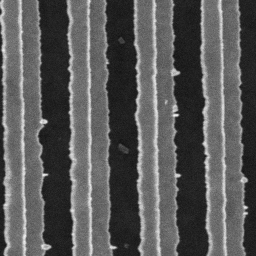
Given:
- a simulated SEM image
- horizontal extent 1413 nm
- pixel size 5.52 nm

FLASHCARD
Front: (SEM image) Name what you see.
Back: lines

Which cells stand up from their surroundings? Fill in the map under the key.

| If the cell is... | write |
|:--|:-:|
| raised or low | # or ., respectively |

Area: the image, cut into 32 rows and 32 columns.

#####...#####....#####...#####..
#####...#####....#####...#####..
#####....####....#####...#####..
#####....####....#####...#####..
#####...#####....#####...#####..
#####....####....#####...#####..
#####....####....#####...#####..
#####....####....#####...#####..
#####....####....#####...#####..
#####....#####...#####...#####..
#####....####....#####...#####..
#####....####....#####...#####..
#####....####....#####....####..
#####....#####...#####...#####..
#####....#####...#####...#####..
######...#####...#####...#####..
#####....#####...#####...#####..
#####....#####...#####...#####..
#####....#####...#####....####..
#####....#####...#####....####..
.####....#####...#####....####..
.####....#####...#####....####..
#####....#####...#####....#####.
.####....#####...#####....####..
.####....#####...#####....####..
.####....#####...#####....#####.
.####....#####...#####....#####.
.####....#####....####....#####.
.####....#####....####....####..
.####....#####....####....####..
.#####...#####....####....####..
.#####...#####....####....#####.